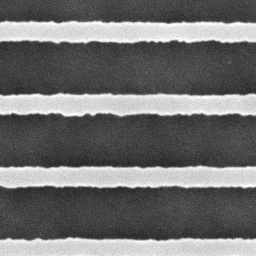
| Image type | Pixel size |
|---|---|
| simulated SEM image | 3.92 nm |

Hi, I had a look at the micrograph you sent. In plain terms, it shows lines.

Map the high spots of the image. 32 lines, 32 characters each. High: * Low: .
................................
................................
................................
********************************
********************************
................................
................................
................................
................................
................................
................................
................................
********************************
********************************
................................
................................
................................
................................
................................
................................
................................
********************************
********************************
................................
................................
................................
................................
................................
................................
................................
********************************
********************************